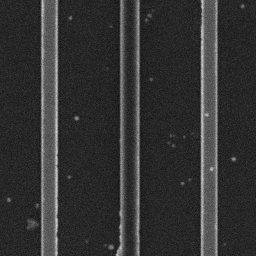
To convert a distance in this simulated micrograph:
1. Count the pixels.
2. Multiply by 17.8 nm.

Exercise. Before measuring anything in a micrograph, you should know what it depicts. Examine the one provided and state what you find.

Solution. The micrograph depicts lines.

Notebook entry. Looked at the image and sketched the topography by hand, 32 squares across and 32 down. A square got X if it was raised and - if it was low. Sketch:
-----XX--------XX--------XX-----
-----XX--------XX--------XX-----
-----XX--------XX--------XX-----
-----XX--------XX--------XX-----
-----XX--------XX--------XX-----
-----XX--------XX--------XX-----
-----XX--------XX--------XX-----
-----XX--------XX--------XX-----
-----XX--------XX--------XX-----
-----XX--------XX--------XX-----
-----XX--------XX--------XX-----
-----XX--------XX--------XX-----
-----XX--------XX--------XX-----
-----XX--------XX--------XX-----
-----XX--------XX--------XX-----
-----XX--------XX--------XX-----
-----XX--------XX--------XX-----
-----XX--------XX--------XX-----
-----XX--------XX--------XX-----
-----XX--------XX--------XX-----
-----XX--------XX--------XX-----
-----XX--------XX--------XX-----
-----XX--------XX--------XX-----
-----XX--------XX--------XX-----
-----XX--------XX--------XX-----
-----XX--------XX--------XX-----
-----XX--------XX--------XX-----
-----XX--------XX--------XX-----
-----XX--------XX--------XX-----
-----XX--------XX--------XX-----
-----XX--------XX--------XX-----
-----XX--------XX--------XX-----